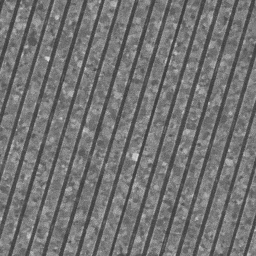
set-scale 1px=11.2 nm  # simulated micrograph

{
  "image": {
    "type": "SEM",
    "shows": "parallel lines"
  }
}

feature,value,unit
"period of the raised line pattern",179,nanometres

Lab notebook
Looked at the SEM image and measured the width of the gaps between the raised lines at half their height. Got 46.8 nm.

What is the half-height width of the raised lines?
131 nm